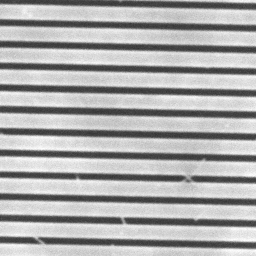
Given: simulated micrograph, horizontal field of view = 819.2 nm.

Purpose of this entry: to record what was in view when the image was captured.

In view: parallel lines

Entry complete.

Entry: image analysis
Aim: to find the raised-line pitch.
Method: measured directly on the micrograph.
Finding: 69.4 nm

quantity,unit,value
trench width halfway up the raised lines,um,0.0236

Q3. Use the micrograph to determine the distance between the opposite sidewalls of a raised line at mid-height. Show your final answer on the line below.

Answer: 47.1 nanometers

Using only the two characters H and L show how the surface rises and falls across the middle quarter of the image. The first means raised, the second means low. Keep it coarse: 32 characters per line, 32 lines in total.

LLLLLLLLLLLLLLLLLLLLLLLLLLLLLHHH
LLLLLLLLLLLLLLLLLLLLLLLLLLLLLLLL
HHHHHHHHHHHHHHHHHHHHHHHHHHLLLLLL
HHHHHHHHHHHHHHHHHHHHHHHHHHHHHHHH
HHHHHHHHHHHHHHHHHHHHHHHHHHHHHHHH
LLLLLLLLLLLLLLHHHHHHHHHHHHHHHHHH
LLLLLLLLLLLLLLLLLLLLLLLLLLLLLLLL
HHHHHHHHHHHHLLLLLLLLLLLLLLLLLLLL
HHHHHHHHHHHHHHHHHHHHHHHHHHHHHHHH
HHHHHHHHHHHHHHHHHHHHHHHHHHHHHHHH
HHHHHHHHHHHHHHHHHHHHHHHHHHHHHHHH
LLLLLLLLLLLLLLLLLLLLLLLLLLLLLLLL
LLLLLLLLLLLLLLLLLLLLLLLLLLLLLLLL
HHHHHHHHHHHHHHHHHHHHHHHHHHHHHHHH
HHHHHHHHHHHHHHHHHHHHHHHHHHHHHHHH
HHHHHHHHHHHHHHHHHHHHHHHHHHHHHHHH
LLLLLLLLLLLHHHHHHHHHHHHHHHHHHHHH
LLLLLLLLLLLLLLLLLLLLLLLLLLLLLLLL
HHHHHHHHHHHLLLLLLLLLLLLLLLLLLLLL
HHHHHHHHHHHHHHHHHHHHHHHHHHHHHHHH
HHHHHHHHHHHHHHHHHHHHHHHHHHHHHHHH
HHHHHHHHHHHHHHHHHHHHHHHHHHHHHHHH
LLLLLLLLLLLLLLLLLLLLLLLLLLLLLLLL
LLLLLLLLLLLLLLLLLLLLLLLLLLLLLLLL
HHHHHHHHHHHHHHHHHHHHHHHHHHHHHHHH
HHHHHHHHHHHHHHHHHHHHHHHHHHHHHHHH
HHHHHHHHHHHHHHHHHHHHHHHHHHHHHHHH
LLLLLLLLLLLLLLLLLHHHHHHHHHHHHHHH
LLLLLLLLLLLLLLLLLLLLLLLLLLLLLLHH
HHHHHHHHHHHHHHHHHHHHHHHHLLLLLHHH
HHHHHHHHHHHHHHHHHHHHHHHHHHHHHHHH
HHHHHHHHHHHHHHHHHHHHHHHHHHHHHHHH